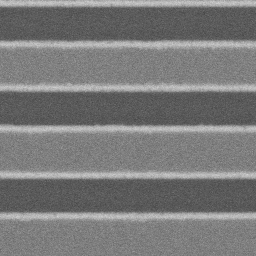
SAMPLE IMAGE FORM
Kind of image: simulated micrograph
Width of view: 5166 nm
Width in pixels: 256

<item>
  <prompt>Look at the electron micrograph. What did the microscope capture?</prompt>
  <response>lines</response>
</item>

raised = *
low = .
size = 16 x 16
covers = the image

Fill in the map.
................
................
................
****************
****************
****************
................
................
****************
****************
****************
................
................
****************
****************
****************